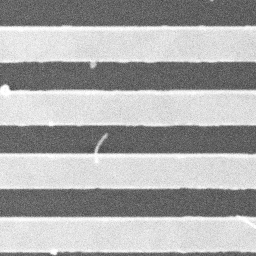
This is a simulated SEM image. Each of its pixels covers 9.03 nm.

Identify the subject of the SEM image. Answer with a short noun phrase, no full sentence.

lines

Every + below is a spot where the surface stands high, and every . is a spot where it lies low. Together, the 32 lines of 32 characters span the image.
................................
................................
................................
++++++++++++++++++++++++++++++++
++++++++++++++++++++++++++++++++
++++++++++++++++++++++++++++++++
++++++++++++++++++++++++++++++++
++++++++++++++++++++++++++++++++
................................
................................
................................
++++++++++++++++++++++++++++++++
++++++++++++++++++++++++++++++++
++++++++++++++++++++++++++++++++
++++++++++++++++++++++++++++++++
++++++++++++++++++++++++++++++++
................................
................................
................................
++++++++++++++++++++++++++++++++
++++++++++++++++++++++++++++++++
++++++++++++++++++++++++++++++++
++++++++++++++++++++++++++++++++
++++++++++++++++++++++++++++++++
................................
................................
................................
++++++++++++++++++++++++++++++++
++++++++++++++++++++++++++++++++
++++++++++++++++++++++++++++++++
++++++++++++++++++++++++++++++++
......+...............++........